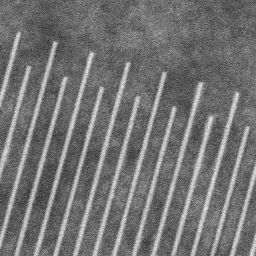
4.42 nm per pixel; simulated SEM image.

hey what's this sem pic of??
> parallel lines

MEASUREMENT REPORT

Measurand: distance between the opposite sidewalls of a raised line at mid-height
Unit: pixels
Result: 3.85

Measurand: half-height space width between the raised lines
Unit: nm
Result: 69.2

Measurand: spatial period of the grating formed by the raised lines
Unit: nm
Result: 83.5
